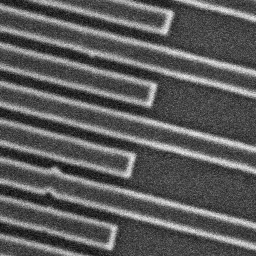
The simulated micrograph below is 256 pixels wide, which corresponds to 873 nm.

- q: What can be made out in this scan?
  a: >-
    parallel lines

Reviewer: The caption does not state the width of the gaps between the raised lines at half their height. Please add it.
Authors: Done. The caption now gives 50.3 nm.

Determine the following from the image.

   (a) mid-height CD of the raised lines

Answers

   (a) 75.5 nm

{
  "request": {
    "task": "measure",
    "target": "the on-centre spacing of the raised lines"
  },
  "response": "0.126 microns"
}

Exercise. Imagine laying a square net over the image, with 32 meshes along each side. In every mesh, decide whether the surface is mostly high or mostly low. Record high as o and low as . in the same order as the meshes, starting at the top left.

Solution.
......ooooooooooo.......oooooooo
oo........ooooooooooo........ooo
oooooo........ooooooo...........
oooooooooo........ooo...........
...ooooooooooo..................
.......ooooooooooo..............
oooo.......ooooooooooo..........
oooooooo.......oooooooooo.......
.oooooooooo.......oooooooooooo..
....ooooooooooo.......oooooooooo
o.......ooooooooooo........ooooo
ooooo.......ooooooo...........oo
oooooooo........ooo.............
.ooooooooooo....................
.....ooooooooooo................
oo.......ooooooooooo............
ooooo........ooooooooooo........
oooooooooo.......ooooooooooo....
..ooooooooooo........oooooooooo.
......oooooooooo........oooooooo
oo........oooooo............oooo
ooooooo.......oo................
oooooooooo......................
...ooooooooooo..................
.......ooooooooooo..............
ooo........ooooooooooo..........
ooooooo........ooooooooooo......
ooooooooooo.......ooooooooooo...
....oooooooooo........oooooooooo
........oooooo............oooooo
oooo........oo................oo
oooooooo........................